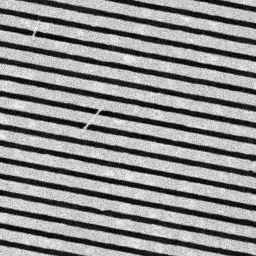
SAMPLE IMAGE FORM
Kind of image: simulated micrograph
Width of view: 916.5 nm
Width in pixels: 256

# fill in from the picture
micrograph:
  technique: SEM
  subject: parallel lines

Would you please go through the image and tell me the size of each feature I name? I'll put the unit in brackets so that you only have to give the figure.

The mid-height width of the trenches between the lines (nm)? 18.4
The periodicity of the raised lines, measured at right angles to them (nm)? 58.2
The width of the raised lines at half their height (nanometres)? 40.4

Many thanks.